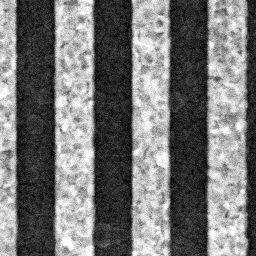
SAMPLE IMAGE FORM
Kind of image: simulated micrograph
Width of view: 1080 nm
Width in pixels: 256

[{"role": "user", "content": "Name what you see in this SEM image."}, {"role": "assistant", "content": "one or a few lines or trenches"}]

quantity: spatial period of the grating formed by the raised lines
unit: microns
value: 0.323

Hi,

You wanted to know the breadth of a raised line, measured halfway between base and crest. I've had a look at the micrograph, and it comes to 140 nm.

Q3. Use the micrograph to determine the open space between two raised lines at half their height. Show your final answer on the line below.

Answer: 43.2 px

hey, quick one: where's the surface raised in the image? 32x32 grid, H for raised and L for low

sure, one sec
HHLLLLLHHHHLLLLLLHHHHLLLLLHHHHLL
HHLLLLLHHHHLLLLLLHHHHLLLLLHHHHLL
HHLLLLLHHHHLLLLLLHHHHLLLLLHHHHLL
HHLLLLLHHHHLLLLLLHHHHLLLLLHHHHLL
HHLLLLLHHHHLLLLLLHHHHLLLLLHHHHLL
HHLLLLLHHHHLLLLLLHHHHLLLLLHHHHLL
HHLLLLLHHHHLLLLLLHHHHLLLLLHHHHLL
HHLLLLLHHHHLLLLLLHHHHLLLLLHHHHLL
HHLLLLLHHHHLLLLLLHHHHLLLLLHHHHLL
HHLLLLLHHHHLLLLLLHHHHLLLLLHHHHLL
HHLLLLLHHHHLLLLLLHHHHLLLLLHHHHLL
HHLLLLLHHHHLLLLLLHHHHLLLLLHHHHLL
HHLLLLLHHHHLLLLLLHHHHLLLLLHHHHLL
HHLLLLLHHHHLLLLLLHHHHLLLLLHHHHLL
HHLLLLLHHHHLLLLLLHHHHLLLLLHHHHLL
HHLLLLLHHHHLLLLLLHHHHLLLLLHHHHLL
HHLLLLLHHHHLLLLLLHHHHLLLLLHHHHLL
HHLLLLLHHHHLLLLLLHHHHLLLLLHHHHLL
HHLLLLLHHHHLLLLLLHHHHLLLLLHHHHLL
HHLLLLLHHHHLLLLLLHHHHLLLLLHHHHLL
HHLLLLLHHHHLLLLLLHHHHLLLLLHHHHLL
HHLLLLLHHHHLLLLLLHHHHLLLLLHHHHLL
HHLLLLLHHHHLLLLLLHHHHLLLLLHHHHLL
HHLLLLLHHHHLLLLLLHHHHLLLLLHHHHLL
HHLLLLLHHHHLLLLLLHHHHLLLLLHHHHLL
HHLLLLLHHHHLLLLLLHHHHLLLLLHHHHLL
HHLLLLLHHHHLLLLLLHHHHLLLLLHHHHLL
HHLLLLLHHHHLLLLLLHHHHLLLLLHHHHLL
HHLLLLLHHHHLLLLLLHHHHLLLLLHHHHLL
HHLLLLLHHHHLLLLLLHHHHLLLLLHHHHLL
HHLLLLLHHHHLLLLLLHHHHLLLLLHHHHLL
HHLLLLLHHHHLLLLLLHHHHLLLLLHHHHLL